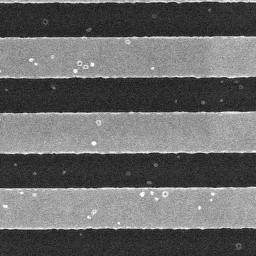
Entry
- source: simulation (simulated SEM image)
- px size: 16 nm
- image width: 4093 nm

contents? lines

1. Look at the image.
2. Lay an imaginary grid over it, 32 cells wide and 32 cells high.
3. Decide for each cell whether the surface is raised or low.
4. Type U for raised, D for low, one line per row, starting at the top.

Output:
DDDDDDDDDDDDDDDDDDDDDDDDDDDDDDDD
DDDDDDDDDDDDDDDDDDDDDDDDDDDDDDDD
DDDDDDDDDDDDDDDDDDDDDDDDDDDDDDDD
DDDDDDDDDDDDDDDDDDDDDDDDDDDDDDDD
DDDDDDDDDDDDDDDDDDDDDDDDDDDDDDDD
UUUUUUUUUUUUUUUUUUUUUUUUUUUUUUUU
UUUUUUUUUUUUUUUUUUUUUUUUUUUUUUUU
UUUUUUUUUUUUUUUUUUUUUUUUUUUUUUUU
UUUUUUUUUUUUUUUUUUUUUUUUUUUUUUUU
UUUUUUUUUUUUUUUUUUUUUUUUUUUUUUUD
DDDDDDDDDDDDDDDDDDDDDDDDDDDDDDDD
DDDDDDDDDDDDDDDDDDDDDDDDDDDDDDDD
DDDDDDDDDDDDDDDDDDDDDDDDDDDDDDDD
DDDDDDDDDDDDDDDDDDDDDDDDDDDDDDDD
UUUUUUUUUUUUUUUUUUUUUUUUUUUUUUUU
UUUUUUUUUUUUUUUUUUUUUUUUUUUUUUUU
UUUUUUUUUUUUUUUUUUUUUUUUUUUUUUUU
UUUUUUUUUUUUUUUUUUUUUUUUUUUUUUUU
UUUUUUUUUUUUUUUUUUUUUUUUUUUUUUUU
DDDDDDDDDDDDDDDDDDDDDDDDDDDDDDDD
DDDDDDDDDDDDDDDDDDDDDDDDDDDDDDDD
DDDDDDDDDDDDDDDDDDDDDDDDDDDDDDDD
DDDDDDDDDDDDDDDDDDDDDDDDDDDDDDDD
DDDDDDDDDDDDDDDDDDDDDDDDDDDDUDDU
UUUUUUUUUUUUUUUUUUUUUUUUUUUUUUUU
UUUUUUUUUUUUUUUUUUUUUUUUUUUUUUUU
UUUUUUUUUUUUUUUUUUUUUUUUUUUUUUUU
UUUUUUUUUUUUUUUUUUUUUUUUUUUUUUUU
UUUUUUUUUUUUUDUDDUUUUUUUDUDDDDDD
DDDDDDDDDDDDDDDDDDDDDDDDDDDDDDDD
DDDDDDDDDDDDDDDDDDDDDDDDDDDDDDDD
DDDDDDDDDDDDDDDDDDDDDDDDDDDDDDDD